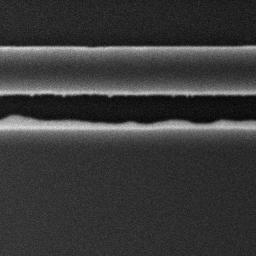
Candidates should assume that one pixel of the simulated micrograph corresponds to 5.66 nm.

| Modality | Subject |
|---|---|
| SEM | lines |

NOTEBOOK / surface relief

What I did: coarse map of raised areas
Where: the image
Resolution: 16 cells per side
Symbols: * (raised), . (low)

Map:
................
................
................
****************
****************
****************
................
................
****************
****************
****************
****************
****************
****************
****************
****************